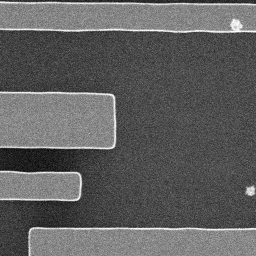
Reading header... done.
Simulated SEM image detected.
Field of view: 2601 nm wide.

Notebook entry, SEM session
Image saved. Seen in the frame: groups of lines, slits or small figures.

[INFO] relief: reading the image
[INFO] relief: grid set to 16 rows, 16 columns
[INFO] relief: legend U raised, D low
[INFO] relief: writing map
UUUUUUUUUUUUUUUU
UUUUUUUUUUUUUUUU
DDDDDDDDDDDDDDDD
DDDDDDDDDDDDDDDD
DDDDDDDDDDDDDDDD
DDDDDDDDDDDDDDDD
UUUUUUUDDDDDDDDD
UUUUUUUDDDDDDDDD
UUUUUUUDDDDDDDDD
DDDDDDDDDDDDDDDD
DDDDDDDDDDDDDDDD
UUUUUDDDDDDDDDDD
DUUUUDDDDDDDDDDD
DDDDDDDDDDDDDDDD
DDUUUUUUUUUUUUUU
DDUUUUUUUUUUUUUU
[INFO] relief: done